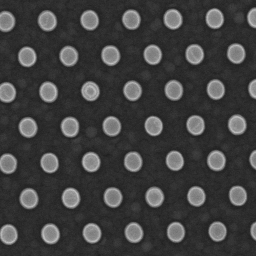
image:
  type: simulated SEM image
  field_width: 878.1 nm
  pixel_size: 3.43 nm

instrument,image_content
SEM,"a regular array of raised bodies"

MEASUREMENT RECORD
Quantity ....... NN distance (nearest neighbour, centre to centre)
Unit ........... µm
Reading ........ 0.14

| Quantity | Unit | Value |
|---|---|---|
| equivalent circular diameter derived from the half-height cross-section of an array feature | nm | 62.5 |